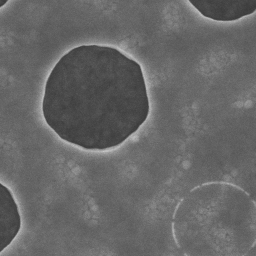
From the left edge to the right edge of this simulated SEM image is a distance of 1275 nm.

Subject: holes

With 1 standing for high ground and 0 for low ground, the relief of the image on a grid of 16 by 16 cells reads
1111111111110000
1111111111111111
1111111111111111
1111000011111111
1110000001111111
1110000001111111
1110000001111111
1110000001111111
1111000011111111
1111111111111111
1111111111111111
1111111111111111
0111111111111111
0111111111111111
0111111111111111
1111111111111111